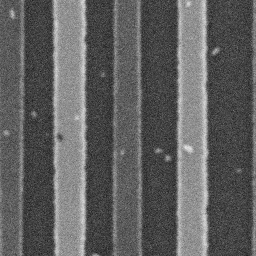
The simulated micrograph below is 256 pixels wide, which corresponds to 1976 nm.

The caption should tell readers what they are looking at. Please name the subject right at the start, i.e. lines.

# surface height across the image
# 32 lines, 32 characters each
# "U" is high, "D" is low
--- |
UUUDDDDUUUUDDDUUUDDDDDUUUUDDDDDD
UUUDDDDUUUUDDDUUUDDDDDUUUUDDDDDD
UUUDDDDUUUUDDDUUUDDDDDUUUUDDDDDD
UUUDDDDUUUUDDDUUUDDDDDUUUUDDDDDD
UUUDDDDUUUUDDDUUUDDDDDUUUUDDDDDD
UUUDDDDUUUUDDDUUUDDDDDUUUUDDDDDD
UUUDDDDUUUUDDDUUUDDDDDUUUUDDDDDD
UUUDDDDUUUUDDDUUUDDDDDUUUUDDDDDD
UUUDDDDUUUUDDDUUUDDDDDUUUUDDDDDD
UUUDDDDUUUUDDDUUUDDDDDUUUUDDDDDD
UUUDDDDUUUDDDDUUUDDDDDUUUUDDDDDD
UUUDDDDUUUUDDDUUUUDDDDUUUUDDDDDD
UUUDDDDUUUUDDDUUUDDDDDUUUUDDDDDD
UUUDDDDUUUUDDDUUUDDDDDUUUUDDDDDD
UUUDDDDUUUUDDDUUUUDDDDUUUUDDDDDD
UUUDDDDUUUUDDDUUUDDDDDUUUUDDDDDD
UUUDDDDUUUUDDDUUUUDDDDUUUUDDDDDD
UUUDDDDUUUUDDDUUUUDDDDUUUUDDDDDD
UUUDDDDUUUUDDDUUUUDDDDUUUUDDDDDD
UUUDDDDUUUUDDDUUUUDDDDUUUUDDDDDD
UUUDDDDUUUUDDDUUUUDDDDUUUUDDDDDD
UUUDDDDUUUUDDDUUUUDDDDUUUUDDDDDD
UUUDDDDUUUUDDDUUUUDDDDUUUUDDDDDD
UUUDDDDUUUUDDDUUUUDDDDUUUUDDDDDD
UUUDDDDUUUUDDDUUUUDDDDUUUUDDDDDD
UUUDDDDUUUUDDDUUUUDDDDUUUUDDDDDD
UUUDDDDUUUUDDDUUUUDDDDUUUUDDDDDD
UUUDDDDUUUUDDDUUUUDDDDUUUUDDDDDD
UUUDDDDUUUUDDDUUUUDDDDUUUUDDDDDD
UUUDDDDUUUUDDDUUUUDDDDUUUUDDDDDD
UUUDDDDUUUDDDDUUUUDDDDUUUUDDDDDD
UUUDDDDUUUDDDDUUUUDDDDUUUUDDDDDD